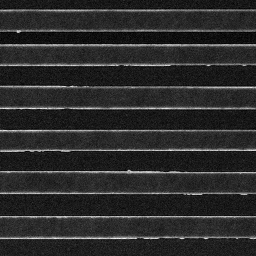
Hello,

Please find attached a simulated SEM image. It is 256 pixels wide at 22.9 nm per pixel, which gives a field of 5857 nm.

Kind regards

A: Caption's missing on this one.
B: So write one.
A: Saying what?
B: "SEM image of lines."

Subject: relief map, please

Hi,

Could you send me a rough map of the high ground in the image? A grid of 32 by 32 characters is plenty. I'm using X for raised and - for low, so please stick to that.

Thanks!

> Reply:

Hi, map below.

--------------------------------
XXXXXXXXXXXXXXXXXXXXXXXXXXXXXXXX
XXXXXXXXXXXXXXXXXXXXXXXXXXXXXXXX
XXXXXXXXXXXXXXXXXXXXXXXXXXXXXXXX
--------------------------------
--------------------------------
XXXXXXXXXXXXXXXXXXXXXXXXXXXXXXXX
XXXXXXXXXXXXXXXXXXXXXXXXXXXXXXXX
--------------------------------
--------------------------------
--------------------------------
XXXXXXXXXXXXXXXXXXXXXXXXXXXXXXXX
XXXXXXXXXXXXXXXXXXXXXXXXXXXXXXXX
XXXXXXXXXXXXXXXXXXXXXXXXXXXXXXXX
--------------------------------
--------------------------------
XXXXXXXXXXXXXXXXXXXXXXXXXXXXXXXX
XXXXXXXXXXXXXXXXXXXXXXXXXXXXXXXX
XXXXXXXXXXXXXXXXXXXXXXXXXXXXXXXX
--------------------------------
--------------------------------
XXXXXXXXXXXXXXXXXXXXXXX---------
XXXXXXXXXXXXXXXXXXXXXXXXXXXXXXXX
XXXXXXXXXXXXXXXXXXXXXXXXXXXXXXXX
--------------------------------
--------------------------------
--------------------------------
XXXXXXXXXXXXXXXXXXXXXXXXXXXXXXXX
XXXXXXXXXXXXXXXXXXXXXXXXXXXXXXXX
XXXXXXXXXXXXXXXXXXXXXXXXXXXXXXXX
--------------------------------
--------------------------------